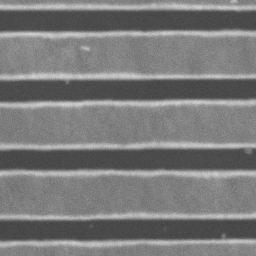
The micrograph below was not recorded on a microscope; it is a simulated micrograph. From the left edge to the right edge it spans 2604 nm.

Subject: lines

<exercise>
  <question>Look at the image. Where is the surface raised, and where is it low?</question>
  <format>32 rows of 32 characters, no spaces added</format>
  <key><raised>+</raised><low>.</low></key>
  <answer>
++++++++++++++++++++++++++++++++
................................
................................
................................
++++++++++++++++++++++++++++++++
++++++++++++++++++++++++++++++++
++++++++++++++++++++++++++++++++
++++++++++++++++++++++++++++++++
++++++++++++++++++++++++++++++++
++++++++++++++++++++++++++++++++
................................
................................
........................+......+
++++++++++++++++++++++++++++++++
++++++++++++++++++++++++++++++++
++++++++++++++++++++++++++++++++
++++++++++++++++++++++++++++++++
++++++++++++++++++++++++++++++++
++++++++++++++++++..............
................................
................................
++++++++++++++++++++++++++++++++
++++++++++++++++++++++++++++++++
++++++++++++++++++++++++++++++++
++++++++++++++++++++++++++++++++
++++++++++++++++++++++++++++++++
++++++++++++++++++++++++++++++++
................................
................................
................................
++++++++++++++++++++++++++++++++
++++++++++++++++++++++++++++++++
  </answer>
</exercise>